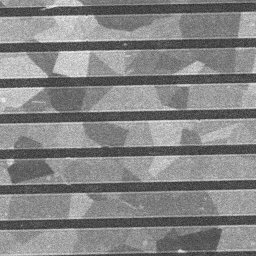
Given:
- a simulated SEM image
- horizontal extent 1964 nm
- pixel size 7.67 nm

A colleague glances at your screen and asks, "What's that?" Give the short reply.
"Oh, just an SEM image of parallel lines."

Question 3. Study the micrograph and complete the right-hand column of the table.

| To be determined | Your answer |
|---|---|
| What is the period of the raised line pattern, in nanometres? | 272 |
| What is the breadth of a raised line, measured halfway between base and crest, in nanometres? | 192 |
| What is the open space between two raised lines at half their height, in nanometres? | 79.6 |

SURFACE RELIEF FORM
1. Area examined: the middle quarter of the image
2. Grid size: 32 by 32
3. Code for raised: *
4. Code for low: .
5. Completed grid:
********************************
********************************
********************************
................................
................................
........................********
********************************
********************************
********************************
********************************
********************************
*************************.......
................................
................................
................****************
********************************
********************************
********************************
********************************
********************************
**********.******...............
................................
................................
**......************************
********************************
********************************
********************************
********************************
********************************
*********.......................
................................
................................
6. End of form